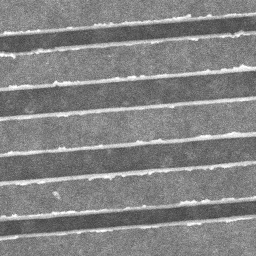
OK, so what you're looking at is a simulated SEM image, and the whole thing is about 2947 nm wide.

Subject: one or a few lines or trenches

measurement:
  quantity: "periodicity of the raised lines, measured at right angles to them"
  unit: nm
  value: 746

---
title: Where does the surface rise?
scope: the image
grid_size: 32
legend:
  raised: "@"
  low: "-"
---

@@@@@@@@@@@@@@@@@@@@@@@@@@@@@@@@
@@@@@@@@@@@@@@@@@@@@@@@@@@@@@@@@
@@@@@@@@@@@@@@@@@@@@@@@---------
@@@@@@@@@@@---------------------
--------------------------@@@@@@
--------------@@@@@@@@@@@@@@@@@@
----@@@@@@@@@@@@@@@@@@@@@@@@@@@@
@@@@@@@@@@@@@@@@@@@@@@@@@@@@@@@@
@@@@@@@@@@@@@@@@@@@@@@@@@@@@@@@@
@@@@@@@@@@@@@@@@@@@@@-----------
@@@@@@@@@-----------------------
--------------------------------
-----------------------------@@@
-----------------@@@@@@@@@@@@@@@
-----@@@@@@@@@@@@@@@@@@@@@@@@@@@
@@@@@@@@@@@@@@@@@@@@@@@@@@@@@@@@
@@@@@@@@@@@@@@@@@@@@@@@@@@@@@@@@
@@@@@@@@@@@@@@@@@@@@@@@@--------
@@@@@@@@@@@@--------------------
--------------------------------
------------------------------@@
------------------@@@@@@@@@@@@@@
------@@@@@@@@@@@@@@@@@@@@@@@@@@
@@@@@@@@@@@@@@@@@@@@@@@@@@@@@@@@
@@@@@@@@@@@@@@@@@@@@@@@@@@@@@@@@
@@@@@@@@@@@@@@@@@@@@@@@@--------
@@@@@@@@@@@@@-------------------
---------------------------@@@@@
--------------@@@@@@@@@@@@@@@@@@
--@-@@@@@@@@@@@@@@@@@@@@@@@@@@@@
@@@@@@@@@@@@@@@@@@@@@@@@@@@@@@@@
@@@@@@@@@@@@@@@@@@@@@@@@@@@@@@@@